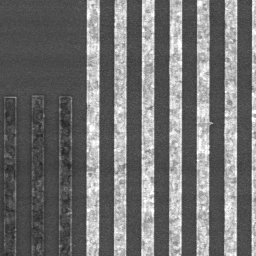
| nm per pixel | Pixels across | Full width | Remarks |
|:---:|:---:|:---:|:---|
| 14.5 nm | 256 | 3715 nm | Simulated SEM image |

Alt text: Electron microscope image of parallel lines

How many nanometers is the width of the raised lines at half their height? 161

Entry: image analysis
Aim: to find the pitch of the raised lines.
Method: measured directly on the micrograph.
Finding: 399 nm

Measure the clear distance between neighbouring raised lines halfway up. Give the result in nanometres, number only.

236